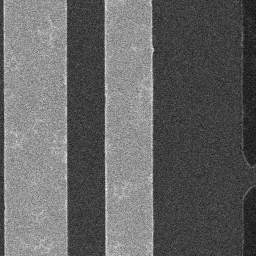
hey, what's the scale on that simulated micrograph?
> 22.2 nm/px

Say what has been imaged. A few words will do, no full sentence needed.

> one or a few lines or trenches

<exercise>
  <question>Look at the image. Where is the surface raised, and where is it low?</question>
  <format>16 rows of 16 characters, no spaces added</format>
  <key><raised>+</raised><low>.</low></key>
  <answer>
++++...++......+
++++...+++.....+
++++...++......+
++++...+++.....+
++++...++......+
++++...++......+
++++...++......+
++++...+++.....+
++++...++......+
++++...++......+
++++...+++......
++++...+++......
++++...+++.....+
++++...+++.....+
++++...+++.....+
++++...+++.....+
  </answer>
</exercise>